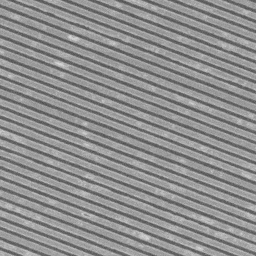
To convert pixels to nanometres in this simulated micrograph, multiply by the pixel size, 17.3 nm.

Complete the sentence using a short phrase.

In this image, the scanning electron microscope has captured parallel lines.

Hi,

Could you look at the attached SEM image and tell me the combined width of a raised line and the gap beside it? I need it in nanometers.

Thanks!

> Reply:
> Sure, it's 164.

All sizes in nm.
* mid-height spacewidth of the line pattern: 66.8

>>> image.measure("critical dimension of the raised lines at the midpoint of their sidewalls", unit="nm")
93.1